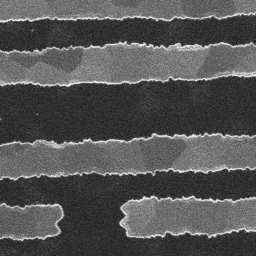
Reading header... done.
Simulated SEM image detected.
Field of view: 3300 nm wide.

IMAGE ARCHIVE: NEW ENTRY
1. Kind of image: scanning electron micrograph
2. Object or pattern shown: one or a few lines or trenches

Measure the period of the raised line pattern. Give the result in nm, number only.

1050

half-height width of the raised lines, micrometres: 0.446